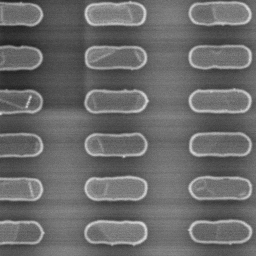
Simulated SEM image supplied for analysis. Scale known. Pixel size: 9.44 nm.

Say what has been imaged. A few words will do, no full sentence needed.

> groups of lines, slits or small figures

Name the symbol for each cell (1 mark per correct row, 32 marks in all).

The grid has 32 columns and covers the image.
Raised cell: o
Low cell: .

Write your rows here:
o...........oo.oo........ooooo..
ooooo......ooooooo......ooooooo.
ooooo......ooooooo......ooooooo.
................................
................................
................................
ooooo......ooooooo......ooooooo.
ooooo......ooooooo......ooooooo.
oooo............................
................................
................................
oooo.......ooooooo......ooooooo.
ooooo......ooooooo......ooooooo.
ooooo......ooooooo......ooooooo.
................................
................................
................................
ooooo......ooooooo......ooooooo.
ooooo......ooooooo......ooooooo.
oooo............................
................................
................................
ooooo......ooooooo......ooooooo.
ooooo......ooooooo......ooooooo.
ooooo......ooooooo......ooooooo.
................................
................................
................................
ooooo......ooooooo......ooooooo.
ooooo......ooooooo......ooooooo.
................................
................................